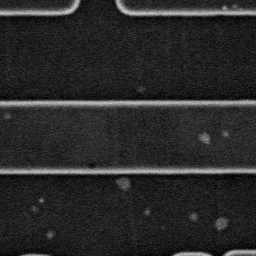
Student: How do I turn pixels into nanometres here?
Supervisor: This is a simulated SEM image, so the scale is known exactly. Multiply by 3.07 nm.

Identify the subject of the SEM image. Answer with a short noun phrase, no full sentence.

wiring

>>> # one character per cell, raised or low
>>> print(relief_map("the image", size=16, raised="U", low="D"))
UUUUUDDUUUUUUUUU
DDDDDDDDDDDDDDDD
DDDDDDDDDDDDDDDD
DDDDDDDDDDDDDDDD
DDDDDDDDDDDDDDDD
DDDDDDDDDDDDDDDD
UUUUUUUUUUUUUUUU
UUUUUUUUUUUUUUUU
UUUUUUUUUUUUUUUU
UUUUUUUUUUUUUUUU
UUUUUUUUUUUUUUUU
DDDDDDDDDDDDDDDD
DDDDDDDDDDDDDDDD
DDDDDDDDDDDDDDDD
DDDDDDDDDDDDDDDD
DDDDDDDDDDDDDDDD